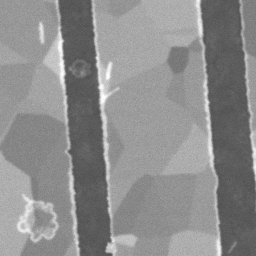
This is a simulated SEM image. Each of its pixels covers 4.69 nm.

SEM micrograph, one or a few lines or trenches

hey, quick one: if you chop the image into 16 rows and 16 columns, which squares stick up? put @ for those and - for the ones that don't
@@@@--@@@@@@---@
@@@@--@@@@@@@--@
@@@@--@@@@@@@--@
@@@@--@@@@@@@--@
@@@@--@@@@@@@--@
@@@@--@@@@@@@--@
@@@@--@@@@@@@---
@@@@--@@@@@@@---
@@@@--@@@@@@@---
@@@@---@@@@@@---
@@@@---@@@@@@---
@@@@@--@@@@@@@--
@@@@@--@@@@@@@--
@@@@@--@@@@@@@--
@@@@@--@@@@@@@--
@@@@@--@@@@@@@--